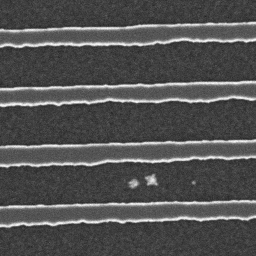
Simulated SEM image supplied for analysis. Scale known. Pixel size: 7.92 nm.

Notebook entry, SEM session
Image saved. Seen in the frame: lines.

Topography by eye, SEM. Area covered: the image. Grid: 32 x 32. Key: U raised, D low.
DDDDDDDDDDDDDDDDDDDDDDDDDDDDDDDD
DDDDDDDDDDDDDDDDDDDDDDDDDDDDDDDD
DDDDDDDDDDDDDDDDDDDDDDDDDDDDDDDD
DDDDDDDDUUUUUUUUUUUUUUUUUUUUUUUU
UUUUUUUUUUUUUUUUUUUUUUUUUUUUUUUU
UUUUUUUUUUUUUUUUUUUDDDDDDDDDDDDD
DDDDDDDDDDDDDDDDDDDDDDDDDDDDDDDD
DDDDDDDDDDDDDDDDDDDDDDDDDDDDDDDD
DDDDDDDDDDDDDDDDDDDDDDDDDDDDDDDD
DDDDDDDDDDDDDDDDDDDDDDDDDDDDDDDD
DDDDDDDDDDDDDDDDDDDDDUUUUUUUUUUU
UUUUUUUUUUUUUUUUUUUUUUUUUUUUUUUU
UUUUUUUUUUUUUUUUUUUUUUUUUUUUDDDU
DDDDDDDDDDDDDDDDDDDDDDDDDDDDDDDD
DDDDDDDDDDDDDDDDDDDDDDDDDDDDDDDD
DDDDDDDDDDDDDDDDDDDDDDDDDDDDDDDD
DDDDDDDDDDDDDDDDDDDDDDDDDDDDDDDD
DDDDDDDDDDDDDDDDDDDDDDDDDDDDDDDU
UUUUUUUUUUUUUUUUUUUUUUUUUUUUUUUU
UUUUUUUUUUUUUUUUUUUUUUUUUUUUUUUU
UUUUUUUUUUUUDDDDDDDDDDDDDDDDDDDD
DDDDDDDDDDDDDDDDDDDDDDDDDDDDDDDD
DDDDDDDDDDDDDDDDDDDDDDDDDDDDDDDD
DDDDDDDDDDDDDDDDDDDDDDDDDDDDDDDD
DDDDDDDDDDDDDDDDDDDDDDDDDDDDDDDD
DDDDDDDDDDDDDUUUUUUUUUUUUUUUUUUU
UUUUUUUUUUUUUUUUUUUUUUUUUUUUUUUU
UUUUUUUUUUUUUUUUUUUUUUDDUUUDDDUD
DDDDDDDDDDDDDDDDDDDDDDDDDDDDDDDD
DDDDDDDDDDDDDDDDDDDDDDDDDDDDDDDD
DDDDDDDDDDDDDDDDDDDDDDDDDDDDDDDD
DDDDDDDDDDDDDDDDDDDDDDDDDDDDDDDD